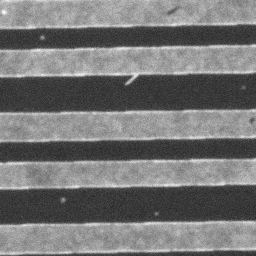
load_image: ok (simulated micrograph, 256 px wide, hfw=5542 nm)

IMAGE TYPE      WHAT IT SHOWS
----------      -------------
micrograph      lines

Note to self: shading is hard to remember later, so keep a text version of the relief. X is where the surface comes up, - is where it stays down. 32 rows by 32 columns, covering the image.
XXXXXXXXXXXXXXXXXXXXXXXXXXXXXXXX
XXXXXXXXXXXXXXXXXXXXXXXXXXXXXXXX
XXXXXXXXXXXXXXXXXXXXXXXXXXXXXXXX
--------------------------------
--------------------------------
--------------------------------
XXXXXXXXXXXXXXXXXXXXXXXXXXXXXXXX
XXXXXXXXXXXXXXXXXXXXXXXXXXXXXXXX
XXXXXXXXXXXXXXXXXXXXXXXXXXXXXXXX
XXX-----------------------------
--------------------------------
--------------------------------
--------------------------------
--------------------------------
XXXXXXXXXXXXXXXXXXXXXXXXXXXXXXXX
XXXXXXXXXXXXXXXXXXXXXXXXXXXXXXXX
XXXXXXXXXXXXXXXXXXXXXXXXXXXXXXXX
XXXXXX--------------------------
--------------------------------
--------------------------------
XXXXXXXXXXXXXXXXXXXXXXXXXXXXXXXX
XXXXXXXXXXXXXXXXXXXXXXXXXXXXXXXX
XXXXXXXXXXXXXXXXXXXXXXXXXXXXXXXX
XXXX----------------------------
--------------------------------
--------------------------------
--------------------------------
--------------------------------
XXXXXXXXXXXXXXXXXXXXXXXXXXXXXXXX
XXXXXXXXXXXXXXXXXXXXXXXXXXXXXXXX
XXXXXXXXXXXXXXXXXXXXXXXXXXXXXXXX
XXXXXXXXXXXXXXX-----------------